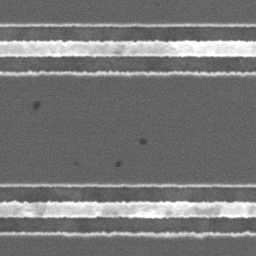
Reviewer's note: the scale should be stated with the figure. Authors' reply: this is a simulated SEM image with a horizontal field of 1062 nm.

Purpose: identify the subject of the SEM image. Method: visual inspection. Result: lines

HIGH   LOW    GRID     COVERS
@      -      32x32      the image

@@@@@@@@@@@@@@@@@@@@@@@@@@@@@@@@
@@@@@@@@@@@@@@@@@@@@@@@@@@@@@@@@
@@@@@@@@@@@@@@@@@@@@@@@@@@@@@@@@
--------------------------------
--------------------------------
@@@@@@@@@@@@@@@@@@@@@@@@@@@@@@@@
@@@@@@@@@@@@@@@@@@@@@@@@@@@@@@@@
--------------------------------
--------------------------------
@@@@@@@@@@@@@@@@@@@@@@@@@@@@@@@@
@@@@@@@@@@@@@@@@@@@@@@@@@@@@@@@@
@@@@@@@@@@@@@@@@@@@@@@@@@@@@@@@@
@@@@@@@@@@@@@@@@@@@@@@@@@@@@@@@@
@@@@@@@@@@@@@@@@@@@@@@@@@@@@@@@@
@@@@@@@@@@@@@@@@@@@@@@@@@@@@@@@@
@@@@@@@@@@@@@@@@@@@@@@@@@@@@@@@@
@@@@@@@@@@@@@@@@@@@@@@@@@@@@@@@@
@@@@@@@@@@@@@@@@@@@@@@@@@@@@@@@@
@@@@@@@@@@@@@@@@@@@@@@@@@@@@@@@@
@@@@@@@@@@@@@@@@@@@@@@@@@@@@@@@@
@@@@@@@@@@@@@@@@@@@@@@@@@@@@@@@@
@@@@@@@@@@@@@@@@@@@@@@@@@@@@@@@@
@@@@@@@@@@@@@@@@@@@@@@@@@@@@@@@@
--------------------------------
--------------------------------
@@@@@@@@@@@@@@@@@@@@@@@@@@@@@@@@
@@@@@@@@@@@@@@@@@@@@@@@@@@@@@@@@
--------------------------------
--------------------------------
@@@@@@@@@@@@@@@@@@@@@@@@@@@@@@@@
@@@@@@@@@@@@@@@@@@@@@@@@@@@@@@@@
@@@@@@@@@@@@@@@@@@@@@@@@@@@@@@@@